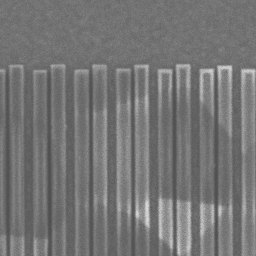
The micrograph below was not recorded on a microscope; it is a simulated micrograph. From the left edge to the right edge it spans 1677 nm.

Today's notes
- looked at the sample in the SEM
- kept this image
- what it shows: parallel lines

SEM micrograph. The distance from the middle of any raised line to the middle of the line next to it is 138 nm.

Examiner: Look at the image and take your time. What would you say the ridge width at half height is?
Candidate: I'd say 86.8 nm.